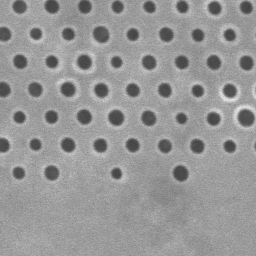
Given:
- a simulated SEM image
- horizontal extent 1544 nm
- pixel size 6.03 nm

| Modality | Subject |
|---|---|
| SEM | a regular array of holes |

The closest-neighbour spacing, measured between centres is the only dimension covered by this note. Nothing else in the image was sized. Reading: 31.7 pixels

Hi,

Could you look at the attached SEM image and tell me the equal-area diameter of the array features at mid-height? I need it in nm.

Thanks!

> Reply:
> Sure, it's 87.5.